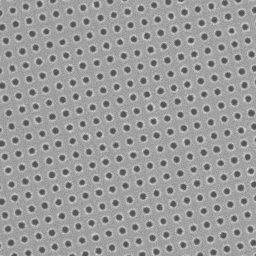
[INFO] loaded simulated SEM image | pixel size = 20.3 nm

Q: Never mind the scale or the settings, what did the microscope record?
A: a regular array of holes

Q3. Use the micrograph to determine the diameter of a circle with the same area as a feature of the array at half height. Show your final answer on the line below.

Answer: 135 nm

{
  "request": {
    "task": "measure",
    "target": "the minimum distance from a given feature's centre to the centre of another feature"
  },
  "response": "276 nm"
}